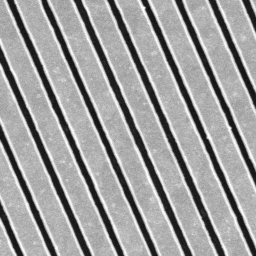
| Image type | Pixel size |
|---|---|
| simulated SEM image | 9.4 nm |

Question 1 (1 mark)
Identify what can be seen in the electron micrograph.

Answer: parallel lines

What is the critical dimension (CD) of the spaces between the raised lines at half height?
78.7 nanometres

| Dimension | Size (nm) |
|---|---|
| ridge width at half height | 211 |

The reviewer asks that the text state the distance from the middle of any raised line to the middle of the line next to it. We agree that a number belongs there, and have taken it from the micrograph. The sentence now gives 290 nanometers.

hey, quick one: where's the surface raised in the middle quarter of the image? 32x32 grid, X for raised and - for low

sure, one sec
X--XXXXXX---XXXXXX--XXXXXX---XXX
X---XXXXXX--XXXXXX---XXXXXX--XXX
XX--XXXXXX---XXXXX---XXXXXX--XXX
XX--XXXXXXX--XXXXXX--XXXXXX---XX
XXX--XXXXXX--XXXXXX---XXXXXX--XX
XXX--XXXXXX---XXXXXX--XXXXXX--XX
XXXX--XXXXXX--XXXXXX---XXXXXX--X
XXXX--XXXXXX---XXXXXX--XXXXXX--X
XXXX---XXXXXX--XXXXXX---XXXXXX--
XXXXX--XXXXXX---XXXXX---XXXXXX--
XXXXX---XXXXX---XXXXXX--XXXXXXX-
XXXXXX--XXXXXX---XXXXX---XXXXXX-
XXXXXX--XXXXXX---XXXXXX--XXXXXX-
XXXXXXX--XXXXXX--XXXXXX---XXXXXX
-XXXXXX--XXXXXX---XXXXXX--XXXXXX
-XXXXXXX--XXXXXX--XXXXXX--XXXXXX
--XXXXXX--XXXXXX---XXXXX---XXXXX
--XXXXXX---XXXXXX--XXXXXX--XXXXX
---XXXXXX--XXXXXX---XXXXX---XXXX
X--XXXXXX---XXXXX---XXXXXX--XXXX
X--XXXXXXX--XXXXXX--XXXXXX---XXX
XX--XXXXXX--XXXXXX---XXXXXX--XXX
XX--XXXXXXX--XXXXXX--XXXXXX---XX
XX---XXXXXX--XXXXXX---XXXXXX--XX
XXX--XXXXXX---XXXXXX--XXXXXX---X
XXX---XXXXXX--XXXXXX---XXXXX---X
XXXX--XXXXXX---XXXXXX--XXXXXX--X
XXXX---XXXXXX--XXXXXX---XXXXX---
XXXXX--XXXXXX---XXXXX---XXXXXX--
XXXXX---XXXXXX--XXXXXX--XXXXXX--
XXXXXX--XXXXXX--XXXXXX---XXXXXX-
XXXXXX--XXXXXX---XXXXXX--XXXXXX-